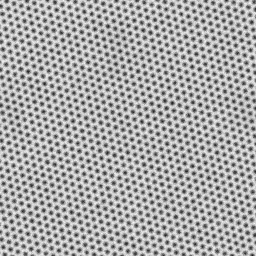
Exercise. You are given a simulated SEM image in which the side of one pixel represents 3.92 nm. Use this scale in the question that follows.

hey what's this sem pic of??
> a regular array of holes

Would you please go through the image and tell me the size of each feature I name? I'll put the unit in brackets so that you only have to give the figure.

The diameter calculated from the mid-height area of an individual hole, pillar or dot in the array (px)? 4.8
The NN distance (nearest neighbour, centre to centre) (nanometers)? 29.3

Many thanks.